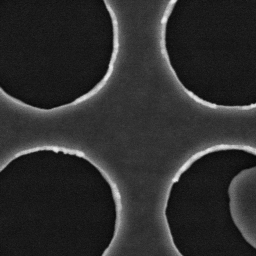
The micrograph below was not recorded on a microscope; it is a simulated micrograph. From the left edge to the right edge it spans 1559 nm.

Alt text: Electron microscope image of holes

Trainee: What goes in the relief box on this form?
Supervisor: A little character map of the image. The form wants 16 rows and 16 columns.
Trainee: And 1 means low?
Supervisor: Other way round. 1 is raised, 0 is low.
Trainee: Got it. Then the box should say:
0000000111100000
0000000111000000
0000000111000000
0000000111100000
0000000111100000
0000001111110000
1000111111111000
1111111111111111
1111111111111111
1100111111111000
0000001111110000
0000000111100000
0000000111000000
0000000111000000
0000000111100000
0000000111100000